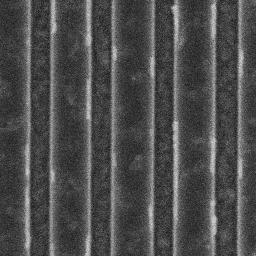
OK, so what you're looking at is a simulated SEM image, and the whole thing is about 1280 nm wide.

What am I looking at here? one or a few lines or trenches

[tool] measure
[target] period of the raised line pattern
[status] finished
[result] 310 nm